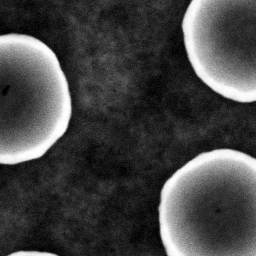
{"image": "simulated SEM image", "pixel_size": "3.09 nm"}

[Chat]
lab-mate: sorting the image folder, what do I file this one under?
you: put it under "raised bodies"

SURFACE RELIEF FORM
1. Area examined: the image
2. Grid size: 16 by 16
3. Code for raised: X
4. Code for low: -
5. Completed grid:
------------XXXX
------------XXXX
X-----------XXXX
XXX---------XXXX
XXXX---------XXX
XXXX----------XX
XXXX------------
XXXX------------
XXXX------------
XXX-------------
-----------XXXXX
-----------XXXXX
----------XXXXXX
----------XXXXXX
----------XXXXXX
-----------XXXXX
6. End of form